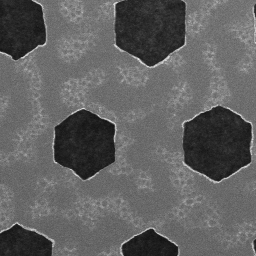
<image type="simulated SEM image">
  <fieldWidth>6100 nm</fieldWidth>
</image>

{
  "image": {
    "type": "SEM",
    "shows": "holes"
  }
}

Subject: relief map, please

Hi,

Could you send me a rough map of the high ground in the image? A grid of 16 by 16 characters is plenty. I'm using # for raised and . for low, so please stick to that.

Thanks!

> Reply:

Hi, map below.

...####.....####
...####.....####
...####.....####
########..######
################
################
################
####...#####...#
###....####.....
###....####.....
####...#####...#
################
################
################
..#######.######
...#####...#####